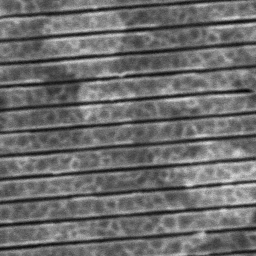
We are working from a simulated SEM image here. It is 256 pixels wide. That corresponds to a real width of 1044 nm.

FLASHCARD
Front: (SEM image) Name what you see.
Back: parallel lines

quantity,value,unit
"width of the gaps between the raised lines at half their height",20.9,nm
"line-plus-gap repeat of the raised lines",94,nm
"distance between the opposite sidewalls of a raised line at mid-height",76.3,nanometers